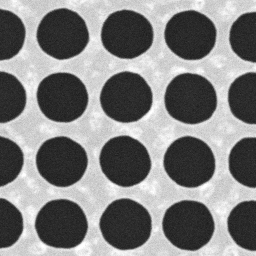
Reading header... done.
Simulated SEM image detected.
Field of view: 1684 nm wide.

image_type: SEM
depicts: a regular array of holes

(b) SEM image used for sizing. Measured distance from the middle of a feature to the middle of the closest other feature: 416 nanometers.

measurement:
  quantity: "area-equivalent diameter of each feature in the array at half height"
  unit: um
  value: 0.339